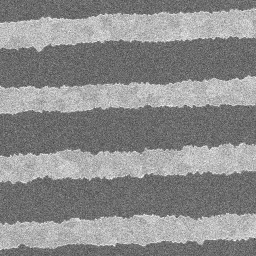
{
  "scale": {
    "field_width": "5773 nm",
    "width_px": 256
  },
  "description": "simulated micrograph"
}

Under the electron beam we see one or a few lines or trenches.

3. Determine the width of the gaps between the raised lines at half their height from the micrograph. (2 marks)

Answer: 966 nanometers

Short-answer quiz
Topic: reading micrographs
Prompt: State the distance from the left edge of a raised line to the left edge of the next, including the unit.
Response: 1520 nm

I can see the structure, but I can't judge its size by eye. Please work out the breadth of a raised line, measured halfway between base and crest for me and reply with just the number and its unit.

566 nm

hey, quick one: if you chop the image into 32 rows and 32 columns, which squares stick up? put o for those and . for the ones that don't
................................
.........................o..oooo
.....ooooooooooooooooooooooooooo
oooooooooooooooooooooooooooooooo
oooooooooooooooooooooooooooooooo
ooooooooo.......................
................................
................................
................................
................................
................oo...ooooooooooo
oooooooooooooooooooooooooooooooo
oooooooooooooooooooooooooooooooo
oooooooooooo....................
................................
................................
................................
................................
.......................ooo.ooooo
..oooooooooooooooooooooooooooooo
oooooooooooooooooooooooooooooooo
oooooooooooooooooooooooooooooo..
oooo............................
................................
................................
................................
................................
.........o..oooooooooooooooooooo
oooooooooooooooooooooooooooooooo
oooooooooooooooooooooooooooooooo
ooooooooo...oo...o..............
................................